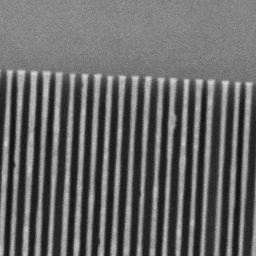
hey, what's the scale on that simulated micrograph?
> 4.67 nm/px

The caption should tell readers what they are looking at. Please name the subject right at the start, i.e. parallel lines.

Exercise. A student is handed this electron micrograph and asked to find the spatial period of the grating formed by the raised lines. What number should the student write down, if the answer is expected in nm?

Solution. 59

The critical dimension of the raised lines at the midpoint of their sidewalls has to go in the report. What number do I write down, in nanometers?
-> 25.7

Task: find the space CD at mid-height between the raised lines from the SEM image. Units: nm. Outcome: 33.8